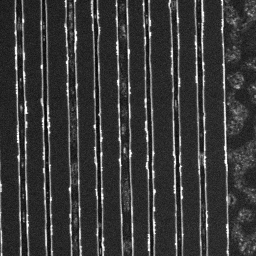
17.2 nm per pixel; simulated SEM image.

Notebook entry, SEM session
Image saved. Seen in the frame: parallel lines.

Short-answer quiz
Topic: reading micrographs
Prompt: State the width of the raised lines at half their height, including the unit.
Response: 344 nanometres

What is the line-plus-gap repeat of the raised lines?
0.443 µm